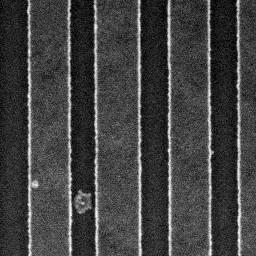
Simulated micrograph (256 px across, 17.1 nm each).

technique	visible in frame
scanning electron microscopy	lines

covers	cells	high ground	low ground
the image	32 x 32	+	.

....+++++...+++++....+++++....++
....+++++...+++++....+++++....++
....+++++...+++++....+++++....++
....+++++...+++++....+++++....++
....+++++...+++++....+++++....++
....+++++...+++++....+++++....++
....+++++...+++++....+++++....++
....+++++...+++++....+++++....++
....+++++...+++++....+++++....++
....+++++...+++++....+++++....++
....+++++...+++++....+++++....++
....+++++...+++++....+++++....++
....+++++...+++++....+++++....++
....+++++...+++++....+++++....++
....+++++...+++++....+++++....++
....+++++...++++++...+++++....++
....+++++...++++++...+++++....++
....+++++...++++++...+++++....++
....+++++...+++++....+++++....++
....+++++...++++++...+++++....++
....+++++...++++++...+++++....++
....+++++...++++++...+++++....++
....+++++...++++++...+++++....++
....+++++...++++++...+++++....++
....+++++...++++++...+++++....++
....+++++...++++++...+++++....++
....+++++...++++++...+++++....++
....+++++...++++++...+++++....++
....+++++...++++++...+++++....++
....+++++...++++++...+++++....++
....+++++...++++++...+++++....++
....+++++...++++++...+++++....++